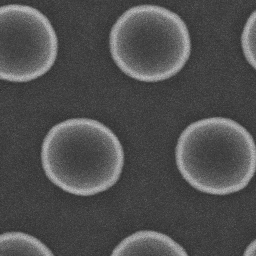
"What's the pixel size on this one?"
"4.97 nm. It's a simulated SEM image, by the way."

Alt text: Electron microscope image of raised bodies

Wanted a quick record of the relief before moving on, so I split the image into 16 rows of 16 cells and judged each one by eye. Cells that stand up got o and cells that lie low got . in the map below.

................
ooo....oooo.....
ooo....ooooo...o
ooo....ooooo....
oo......ooo.....
................
................
................
...oooo.....ooo.
...oooo....ooooo
...oooo....ooooo
....ooo.....ooo.
................
................
................
ooo....oooo.....